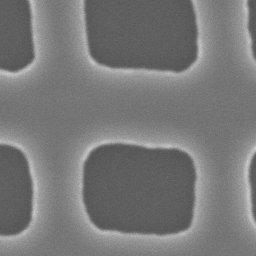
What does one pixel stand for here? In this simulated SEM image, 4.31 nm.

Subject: holes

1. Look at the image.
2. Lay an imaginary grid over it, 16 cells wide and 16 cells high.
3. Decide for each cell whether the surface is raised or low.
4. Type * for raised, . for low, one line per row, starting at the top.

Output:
..***.......***.
..***.......***.
..***.......****
..****......****
.***************
****************
****************
****************
****************
.*****......****
..***.......****
..***.......****
..***.......****
..***.......****
.******....*****
****************